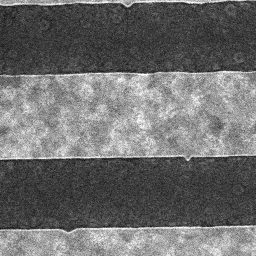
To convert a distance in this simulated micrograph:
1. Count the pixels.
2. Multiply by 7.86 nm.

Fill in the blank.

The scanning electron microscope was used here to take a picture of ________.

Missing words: one or a few lines or trenches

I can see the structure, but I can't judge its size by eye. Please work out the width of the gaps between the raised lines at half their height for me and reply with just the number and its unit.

557 nanometres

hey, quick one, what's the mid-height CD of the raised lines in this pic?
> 657 nm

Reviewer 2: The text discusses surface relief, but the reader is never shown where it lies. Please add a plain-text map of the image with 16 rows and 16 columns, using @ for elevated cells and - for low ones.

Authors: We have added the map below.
----------------
----------------
----------------
----------------
-------------@@@
@@@@@@@@@@@@@@@@
@@@@@@@@@@@@@@@@
@@@@@@@@@@@@@@@@
@@@@@@@@@@@@@@@@
@@@@@@@@@@@@@@@@
----------------
----------------
----------------
----------------
@@@@@@@@@@@@@@@@
@@@@@@@@@@@@@@@@